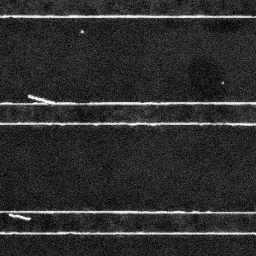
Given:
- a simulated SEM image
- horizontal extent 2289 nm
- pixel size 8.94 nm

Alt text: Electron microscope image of lines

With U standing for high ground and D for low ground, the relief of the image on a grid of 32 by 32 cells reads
UUUUUUUUUUUUUUUUUUUUUUUUUUUUUUUU
UUUUUUUUUUUUUUUUUUUUUUUUUUUUUUUU
DDDDDDDDDDDDDDDDDDDDDDDDDDDDDDDD
DDDDDDDDDDDDDDDDDDDDDDDDDDDDDDDD
DDDDDDDDDDDDDDDDDDDDDDDDDDDDDDDD
DDDDDDDDDDDDDDDDDDDDDDDDDDDDDDDD
DDDDDDDDDDDDDDDDDDDDDDDDDDDDDDDD
DDDDDDDDDDDDDDDDDDDDDDDDDDDDDDDD
DDDDDDDDDDDDDDDDDDDDDDDDDDDDDDDD
DDDDDDDDDDDDDDDDDDDDDDDDDDDDDDDD
DDDDDDDDDDDDDDDDDDDDDDDDDDDDDDDD
DDDDDDDDDDDDDDDDDDDDDDDDDDDDDDDD
DDDDDDDDDDDDDDDDDDDDDDDDDDDDDDDD
UUUUUUUUUUUUUUUUUUUUUUUUUUUUUUUU
UUUUUUUUUUUUUUUUUUUUUUUUUUUUUUUU
DDDDDDDUDDDUDDDDUDDDDDDDDDDDUUUU
DDDDDDDDDDDDDDDDDDDDDDDDDDDDDDDD
DDDDDDDDDDDDDDDDDDDDDDDDDDDDDDDD
DDDDDDDDDDDDDDDDDDDDDDDDDDDDDDDD
DDDDDDDDDDDDDDDDDDDDDDDDDDDDDDDD
DDDDDDDDDDDDDDDDDDDDDDDDDDDDDDDD
DDDDDDDDDDDDDDDDDDDDDDDDDDDDDDDD
DDDDDDDDDDDDDDDDDDDDDDDDDDDDDDDD
DDDDDDDDDDDDDDDDDDDDDDDDDDDDDDDD
DDDDDDDDDDDDDDDDDDDDDDDDDDDDDDDD
DDDDDDDDDDDDDDDDDDDDDDDDDDDDDDDD
UUUUUUUUUUUUUUUUUUUDUUUDDDUDDDDD
UUUUUUUUUUUUUUUUUUUUUUUUUUUUUUUU
UUUUUUUUUUUUUUUUUUUUUUUUUUUUUUUU
DDDDDDDDDDDDDDDDDDDDDDDDDDDDDDDD
DDDDDDDDDDDDDDDDDDDDDDDDDDDDDDDD
DDDDDDDDDDDDDDDDDDDDDDDDDDDDDDDD